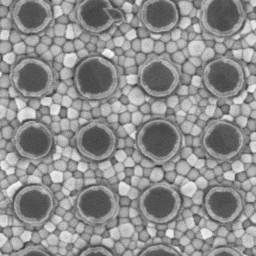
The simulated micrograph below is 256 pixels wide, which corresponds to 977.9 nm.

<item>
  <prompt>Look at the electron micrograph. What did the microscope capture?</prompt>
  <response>a regular array of raised bodies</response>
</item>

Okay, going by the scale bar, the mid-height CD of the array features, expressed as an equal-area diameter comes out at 143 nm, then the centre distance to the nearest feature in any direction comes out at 239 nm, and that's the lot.